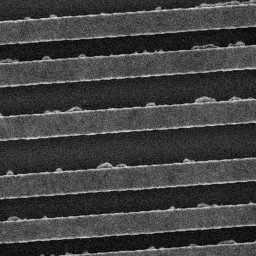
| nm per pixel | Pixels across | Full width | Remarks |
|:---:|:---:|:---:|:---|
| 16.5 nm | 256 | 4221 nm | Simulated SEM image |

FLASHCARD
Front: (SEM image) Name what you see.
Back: lines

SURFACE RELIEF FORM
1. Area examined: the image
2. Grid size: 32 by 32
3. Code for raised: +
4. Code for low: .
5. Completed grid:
...............................+
.................+++++++++++++++
...+++++++++++++++++++++++++++++
++++++++++++++++++++++++++++++..
+++++++++++++++.................
+...............................
.....................+++++++++++
.......+++++++++++++++++++++++++
++++++++++++++++++++++++++++++++
+++++++++++++++++++.............
+++++...........................
................................
..............................++
................++++++++++++++++
..++++++++++++++++++++++++++++++
++++++++++++++++++++++++++++....
+++++++++++++++.................
+...............................
................................
................................
.....................+++++++++++
........++++++++++++++++++++++++
++++++++++++++++++++++++++++++++
+++++++++++++++++++.............
+++++...........................
................................
.................+++++++++++++++
...+++++++++++++++++++++++++++++
++++++++++++++++++++++++++++....
+++++++++++++...................
.............................+++
...............+++++++++++++++++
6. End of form